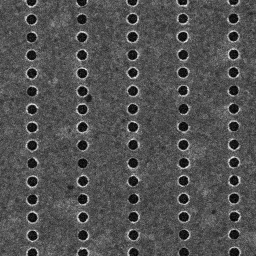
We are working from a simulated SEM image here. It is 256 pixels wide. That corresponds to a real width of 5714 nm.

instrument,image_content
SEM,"a regular array of holes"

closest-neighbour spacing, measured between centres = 0.399 microns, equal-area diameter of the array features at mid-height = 225 nm